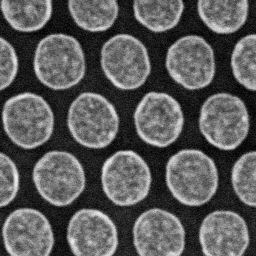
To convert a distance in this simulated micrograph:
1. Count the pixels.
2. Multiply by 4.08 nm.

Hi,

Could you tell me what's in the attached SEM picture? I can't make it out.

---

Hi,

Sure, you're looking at a regular array of raised bodies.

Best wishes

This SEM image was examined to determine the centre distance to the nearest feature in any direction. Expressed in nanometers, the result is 267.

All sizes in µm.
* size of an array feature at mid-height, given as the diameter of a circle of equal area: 0.208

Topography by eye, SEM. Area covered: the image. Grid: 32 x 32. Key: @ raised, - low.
@@@@@@---@@@@@---@@@@@@--@@@@@@-
-@@@@@---@@@@@@--@@@@@@--@@@@@@-
-@@@@@---@@@@@---@@@@@---@@@@@--
--@@@------@@------@@-----@@@@--
------@@-------@---------------@
@----@@@@@---@@@@@----@@@@----@@
@@---@@@@@---@@@@@---@@@@@---@@@
@@--@@@@@@---@@@@@---@@@@@@--@@@
@@--@@@@@@---@@@@@@--@@@@@@--@@@
@@---@@@@@---@@@@@----@@@@---@@@
@-----@@@-----@@@@-----@@@----@@
--------------------------------
-@@@@-----@@@-----@@@@----@@@@--
-@@@@@---@@@@@---@@@@@---@@@@@@-
@@@@@@---@@@@@@--@@@@@@--@@@@@@-
-@@@@@---@@@@@@--@@@@@@--@@@@@@-
-@@@@@---@@@@@---@@@@@---@@@@@@-
--@@@@----@@@@----@@@@----@@@@--
----------------------------@---
@-----@@@-----@@@-----@@@@----@@
@@---@@@@@---@@@@@---@@@@@@---@@
@@--@@@@@@---@@@@@@--@@@@@@--@@@
@@--@@@@@@---@@@@@@--@@@@@@--@@@
@@---@@@@@---@@@@@---@@@@@@--@@@
@@---@@@@@----@@@@----@@@@----@@
@------@-------@--------@------@
--@@@-----@@------@@@-----------
-@@@@@---@@@@@---@@@@@----@@@@--
-@@@@@---@@@@@---@@@@@@--@@@@@@-
-@@@@@--@@@@@@@--@@@@@@--@@@@@@-
-@@@@@@--@@@@@@--@@@@@@--@@@@@@-
-@@@@@---@@@@@---@@@@@@---@@@@--